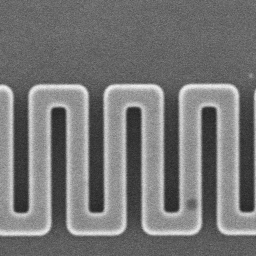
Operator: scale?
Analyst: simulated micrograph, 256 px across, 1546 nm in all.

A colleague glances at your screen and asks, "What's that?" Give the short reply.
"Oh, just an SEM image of groups of lines, slits or small figures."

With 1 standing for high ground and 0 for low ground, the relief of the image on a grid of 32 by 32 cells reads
00000000000000000000000000000000
00000000000000000000000000000000
00000000000000000000000000000000
00000000000000000000000000000000
00000000000000000000000000000000
00000000000000000000000000000000
00000000000000000000000000000000
00000000000000000000000000000000
00000000000000000000000000000000
00000000000000000000000000000000
00000000000000000000000000000000
10001111111001111111000111111100
11001111111001111111001111111100
11001110111001110111001110011100
11001100111001110011001110011100
11001100111001110011001110011100
11001100111001110011001110011100
11001100111001110011001110011100
11001100111001110011001110011100
11001100111001110011001110011100
11001100111001110011001110011100
11001100111001110011001110011100
11001100111001110011001110011100
11001100111001110011001110011100
11001100111001110011001110011100
11001100111001110011001110011100
11011100111001110011101110011101
11111100111111110011111110011111
11111100111111110011111110011111
00000000000000000000000000000000
00000000000000000000000000000000
00000000000000000000000000000000